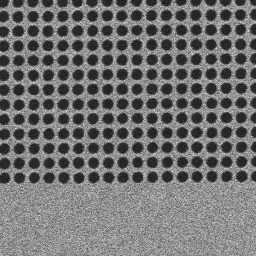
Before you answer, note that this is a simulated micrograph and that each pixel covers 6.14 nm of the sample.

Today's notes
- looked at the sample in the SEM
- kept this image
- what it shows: a regular array of holes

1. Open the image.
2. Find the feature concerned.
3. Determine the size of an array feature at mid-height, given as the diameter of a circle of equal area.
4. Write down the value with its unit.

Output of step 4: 68.5 nanometers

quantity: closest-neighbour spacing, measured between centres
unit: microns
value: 0.0879